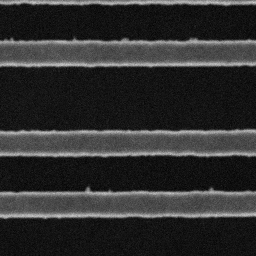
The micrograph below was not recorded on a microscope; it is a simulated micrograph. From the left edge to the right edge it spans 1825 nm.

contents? lines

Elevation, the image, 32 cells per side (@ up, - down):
@@--@@@@@@@@@@@@@@@-@@-@@@@@@@@@
--------------------------------
--------------------------------
--------------------------------
--------------------------------
@@@@@@@@@@@@@@@@@@@@@@@@@@@@@@@@
@@@@@@@@@@@@@@@@@@@@@@@@@@@@@@@@
@@@@@@@@@@@@@@@@@@@@@@@@@@@@@@@@
--------------------------------
--------------------------------
--------------------------------
--------------------------------
--------------------------------
--------------------------------
--------------------------------
--------------------------------
@@@@@@@@@@@@@@@@@@@@@@@@@@@@@@@@
@@@@@@@@@@@@@@@@@@@@@@@@@@@@@@@@
@@@@@@@@@@@@@@@@@@@@@@@@@@@@@@@@
-----@@@@@--@@-----------@-----@
--------------------------------
--------------------------------
--------------------------------
--------------------------------
@@@@@@@@@@@@@@@@@@@@@@@@@@@@@@@@
@@@@@@@@@@@@@@@@@@@@@@@@@@@@@@@@
@@@@@@@@@@@@@@@@@@@@@@@@@@@@@@@@
--------------------------------
--------------------------------
--------------------------------
--------------------------------
--------------------------------